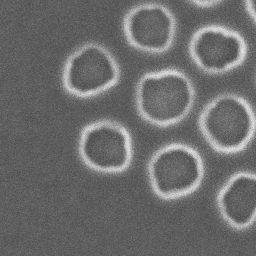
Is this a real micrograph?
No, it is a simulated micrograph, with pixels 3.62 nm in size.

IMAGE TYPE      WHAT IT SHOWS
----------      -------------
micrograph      holes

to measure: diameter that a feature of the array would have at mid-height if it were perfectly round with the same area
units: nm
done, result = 161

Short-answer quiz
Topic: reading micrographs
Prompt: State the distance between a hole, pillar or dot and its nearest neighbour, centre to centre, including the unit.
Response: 251 nm